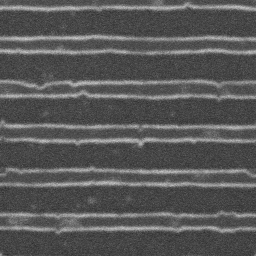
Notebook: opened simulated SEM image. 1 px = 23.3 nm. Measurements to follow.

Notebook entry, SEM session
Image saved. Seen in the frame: parallel lines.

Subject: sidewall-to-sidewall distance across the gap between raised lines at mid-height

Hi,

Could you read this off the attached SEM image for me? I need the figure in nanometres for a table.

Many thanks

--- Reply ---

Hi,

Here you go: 703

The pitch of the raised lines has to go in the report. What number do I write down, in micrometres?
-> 1.03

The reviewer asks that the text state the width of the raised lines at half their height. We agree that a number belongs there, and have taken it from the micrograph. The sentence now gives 321 nm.